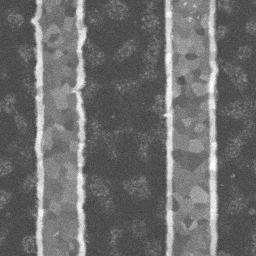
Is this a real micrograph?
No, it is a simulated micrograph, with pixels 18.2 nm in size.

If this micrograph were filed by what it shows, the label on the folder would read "one or a few lines or trenches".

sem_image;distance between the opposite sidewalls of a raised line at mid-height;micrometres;0.791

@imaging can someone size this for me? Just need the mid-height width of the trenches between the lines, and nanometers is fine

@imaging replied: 1600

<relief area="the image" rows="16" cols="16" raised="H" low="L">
LLHHHLLLLLHHHLLL
LLHHHLLLLLLHHLLL
LLHHHLLLLLHHHLLL
LLHHHLLLLLLHHLLL
LLHHHLLLLLLHHLLL
LLHHHLLLLLLHHLLL
LLHHHLLLLLLHHLLL
LLHHHLLLLLLHHLLL
LLHHHLLLLLLHHLLL
LLHHHLLLLLLHHLLL
LLLHHLLLLLLHHLLL
LLLHHLLLLLLHHLLL
LLLHHLLLLLLHHLLL
LLHHHLLLLLLHHLLL
LLHHHLLLLLLHHLLL
LLHHHLLLLLLHHLLL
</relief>